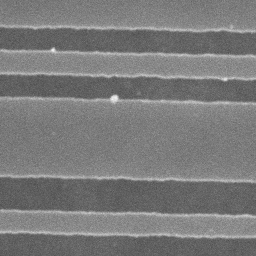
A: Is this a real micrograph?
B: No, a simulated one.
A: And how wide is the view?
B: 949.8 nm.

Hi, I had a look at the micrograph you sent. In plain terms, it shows lines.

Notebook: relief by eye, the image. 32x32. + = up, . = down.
++++++++++++++++++++++++++++++++
++++++++++++++++++++++++++++++++
++++++++++++++++++++++++++++++++
....+....+.+++++++++++++++++++++
................................
................................
+++++++.........................
++++++++++++++++++++++++++++++++
++++++++++++++++++++++++++++++++
.............+..+..+++++++++++++
................................
................................
+++++++++++.+++.................
++++++++++++++++++++++++++++++++
++++++++++++++++++++++++++++++++
++++++++++++++++++++++++++++++++
++++++++++++++++++++++++++++++++
++++++++++++++++++++++++++++++++
++++++++++++++++++++++++++++++++
++++++++++++++++++++++++++++++++
++++++++++++++++++++++++++++++++
++++++++++++++++++++++++++++++++
..................+++.++++++++++
................................
................................
................................
++++++++........................
++++++++++++++++++++++++++++++++
++++++++++++++++++++++++++++++++
.................+....++++++++++
................................
................................